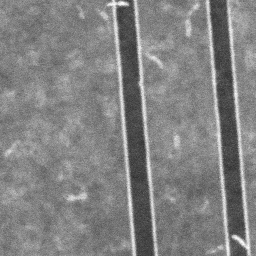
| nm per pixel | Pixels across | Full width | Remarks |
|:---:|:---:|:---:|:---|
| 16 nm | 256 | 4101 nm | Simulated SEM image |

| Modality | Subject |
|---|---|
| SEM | one or a few lines or trenches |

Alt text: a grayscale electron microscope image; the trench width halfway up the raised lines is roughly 71.4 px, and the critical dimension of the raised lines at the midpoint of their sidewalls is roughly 0.335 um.